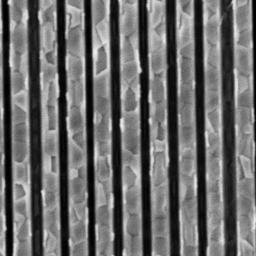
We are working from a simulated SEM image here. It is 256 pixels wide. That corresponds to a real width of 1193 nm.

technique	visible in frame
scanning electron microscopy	parallel lines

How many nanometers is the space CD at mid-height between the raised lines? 40.2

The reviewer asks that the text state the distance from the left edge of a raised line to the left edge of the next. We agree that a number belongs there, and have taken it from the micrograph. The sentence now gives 130 nanometers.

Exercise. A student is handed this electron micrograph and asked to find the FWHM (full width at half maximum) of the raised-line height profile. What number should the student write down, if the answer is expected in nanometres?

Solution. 88.5